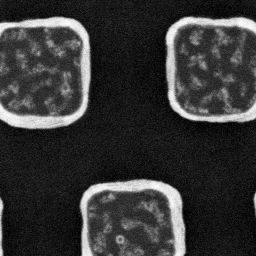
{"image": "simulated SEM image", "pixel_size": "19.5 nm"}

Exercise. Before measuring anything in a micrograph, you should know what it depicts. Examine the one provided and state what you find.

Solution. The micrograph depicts raised bodies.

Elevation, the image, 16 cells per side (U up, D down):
DDDDDDDDDDDDDDDD
UUUUDDDDDDDUUUUU
UUUUUDDDDDDUUUUU
UUUUUDDDDDDUUUUU
UUUUUDDDDDDUUUUU
UUUUUDDDDDDUUUUU
UUUUUDDDDDDUUUUU
DUUUDDDDDDDDDDDD
DDDDDDDDDDDDDDDD
DDDDDDDDDDDDDDDD
DDDDDDDDDDDDDDDD
DDDDDDDDDDDDDDDD
DDDDDUUUUUUDDDDD
DDDDDUUUUUUDDDDD
DDDDDUUUUUUDDDDD
DDDDDUUUUUUDDDDD